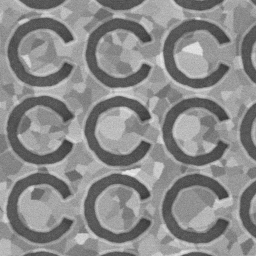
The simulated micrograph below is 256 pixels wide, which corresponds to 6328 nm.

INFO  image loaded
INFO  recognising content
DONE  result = an array of small figures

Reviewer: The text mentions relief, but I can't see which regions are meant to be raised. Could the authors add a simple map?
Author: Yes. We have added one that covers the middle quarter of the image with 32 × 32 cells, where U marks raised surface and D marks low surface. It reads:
DDDUUUDDDUUUUUUUUUUDDDUUUDDDDUUU
DDUUUUDDDDUUUUUUUUDDDDUUUDDDDUUU
DDUUUUUDDDDDUUUUDDDDDUUUUUDDDDUU
DUUUUUUUDDDDDDDDDDDDDUUUUUUDDDDD
UUUUUUUUUDDDDDDDDDDDUUUUUUUUDDDD
UUUUUUUUUUDDDDDDDDUUUUUUUUUUUUDD
UUUUUUUUUUUUUUUUUUUUUUUUUUUUUUUU
UUUUUUUUUUUUUUUUUUUUUUUUUUUUUUUU
UUUUUUUUUUUDDDDDDUUUUUUUUUUUUUDD
UUUUUUUUDDDDDDDDDDDUUUUUUUUUDDDD
DUUUUUUDDDDDDDDDDDDDUUUUUUUDDDDD
DDUUUUDDDDDUUUUUDDDDDUUUUUDDDDDD
DDUUUUDDDDUUUUUUUUDDDDUUUDDDDDUU
DDDUUUDDDUUUUUUUUUUDDDUUUDDDDUUU
DUUUUDDDDUUUUUUUUUUDUUUUUDDDUUUU
UUUUUDDDUUUUUUUUUUUUUUUUDDDDUUUU
UUUUUDDDUUUUUUUUUUUUUUUUDDDDUUUU
UUUUUDDDUUUUUUUUUUUUUUUUDDDDUUUU
UUUUUDDDUUUUUUUUUUUUUUUUDDDDUUUU
DDUUUDDDDUUUUUUUUUUDDUUUUDDDUUUU
DDUUUUDDDDUUUUUUUUDDDDUUUDDDDUUU
DDUUUUDDDDDUUUUUUDDDDUUUUDDDDDUU
DUUUUUUDDDDDDDDDDDDDDUUUUUDDDDDD
UUUUUUUUDDDDDDDDDDDDUUUUUUUDDDDD
UUUUUUUUUDDDDDDDDDDUUUUUUUUUDDDD
UUUUUUUUUUUDDDDDUUUUUUUUUUUUUUUD
UUUUUUUUUUUUUUUUUUUUUUUUUUUUUUUU
UUUUUUUUUUUDDDDDUUUUUUUUUUUUUUDD
UUUUUUUUUDDDDDDDDDUUUUUUUUUUDDDD
UUUUUUUDDDDDDDDDDDDUUUUUUUUDDDDD
DUUUUUDDDDDDUUUDDDDDDUUUUUUDDDDD
DDUUUUDDDDDUUUUUUDDDDUUUUUDDDDUU